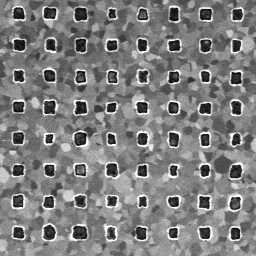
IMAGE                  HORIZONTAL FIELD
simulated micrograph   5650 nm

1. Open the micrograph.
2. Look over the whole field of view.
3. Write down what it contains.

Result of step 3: a regular array of holes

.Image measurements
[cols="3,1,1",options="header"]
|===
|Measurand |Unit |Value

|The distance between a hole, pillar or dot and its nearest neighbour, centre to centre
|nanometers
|679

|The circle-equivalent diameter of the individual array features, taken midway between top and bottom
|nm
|277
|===